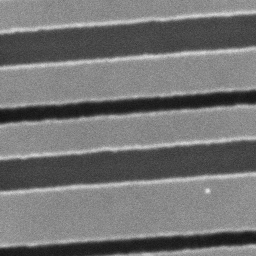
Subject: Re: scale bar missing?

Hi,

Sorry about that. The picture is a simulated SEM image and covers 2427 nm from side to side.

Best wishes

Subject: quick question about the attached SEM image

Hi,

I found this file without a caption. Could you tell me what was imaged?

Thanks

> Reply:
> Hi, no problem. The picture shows lines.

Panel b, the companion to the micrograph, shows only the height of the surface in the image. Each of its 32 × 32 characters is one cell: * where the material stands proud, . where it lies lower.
********************************
********************************
******************..............
*******.........................
................................
................................
..........................******
..............******************
********************************
********************************
********************************
**************************......
***********.....................
...........................*****
................****************
.*******************************
********************************
*****************************...
*****************...............
****............................
................................
................................
......................**********
.......*************************
********************************
********************************
********************************
********************************
********************************
******************..............
*****...........................
......................**********